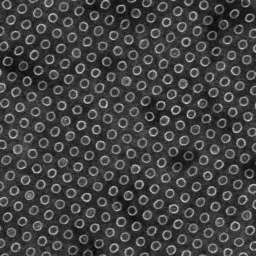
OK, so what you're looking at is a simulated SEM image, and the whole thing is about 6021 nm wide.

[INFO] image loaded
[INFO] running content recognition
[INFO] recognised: a regular array of raised bodies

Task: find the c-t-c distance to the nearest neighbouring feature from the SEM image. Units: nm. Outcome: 362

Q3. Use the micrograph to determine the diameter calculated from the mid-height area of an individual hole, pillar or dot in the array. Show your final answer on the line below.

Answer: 199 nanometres